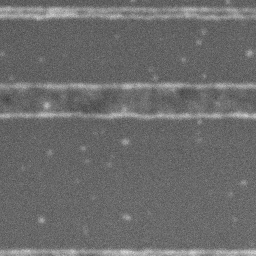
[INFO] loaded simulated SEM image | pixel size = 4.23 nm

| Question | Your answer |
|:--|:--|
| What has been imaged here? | lines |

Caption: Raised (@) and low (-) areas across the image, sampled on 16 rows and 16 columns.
----------------
----------------
----------------
----------------
----------------
@@@@@@@@@@@@@@@@
@@@@@@@@@@@@@@@@
----------------
----------------
----------------
----------------
----------------
----------------
----------------
----------------
----------------